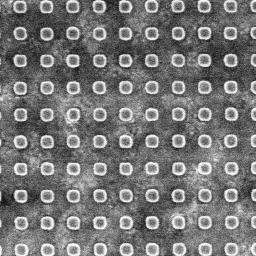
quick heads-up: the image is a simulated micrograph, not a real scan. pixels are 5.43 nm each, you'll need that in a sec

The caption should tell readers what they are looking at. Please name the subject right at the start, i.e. a regular array of raised bodies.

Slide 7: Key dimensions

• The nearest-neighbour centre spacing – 142 nm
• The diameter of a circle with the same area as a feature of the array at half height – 0.0712 micrometres